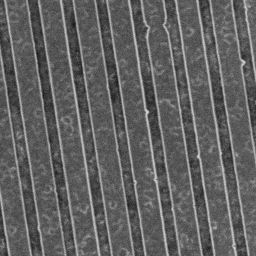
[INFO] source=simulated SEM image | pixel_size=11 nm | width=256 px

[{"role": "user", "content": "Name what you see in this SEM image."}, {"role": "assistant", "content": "parallel lines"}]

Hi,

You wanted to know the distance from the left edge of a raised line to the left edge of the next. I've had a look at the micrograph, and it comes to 371 nm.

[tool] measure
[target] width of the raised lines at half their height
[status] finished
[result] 243 nm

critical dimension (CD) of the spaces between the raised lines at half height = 0.132 µm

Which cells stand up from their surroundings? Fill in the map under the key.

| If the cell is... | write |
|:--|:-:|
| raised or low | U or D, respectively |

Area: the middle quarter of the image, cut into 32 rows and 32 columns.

UUDDDUUUUUDDDUUUUUUDDDUUUUUDDDDU
UUDDDUUUUUDDDUUUUUUDDDUUUUUDDDDU
UUDDDUUUUUUDDDUUUUUDDDUUUUUUDDDU
UUDDDUUUUUUDDDUUUUUDDDUUUUUUDDDU
UUDDDUUUUUUDDDUUUUUDDDUUUUUUDDDU
UUDDDDUUUUUDDDUUUUUDDDDUUUUUDDDU
UUUDDDUUUUUDDDUUUUUUDDDUUUUUDDDU
UUUDDDUUUUUDDDUUUUUUDDDUUUUUDDDD
UUUDDDUUUUUDDDUUUUUUDDDUUUUUUDDD
UUUDDDUUUUUUDDDUUUUUDDDUUUUUUDDD
UUUDDDUUUUUUDDDUUUUUDDDUUUUUUDDD
UUUDDDUUUUUUDDDUUUUUUDDDUUUUUDDD
UUUDDDDUUUUUDDDUUUUUUDDDUUUUUDDD
UUUUDDDUUUUUDDDUUUUUUDDDUUUUUDDD
UUUUDDDUUUUUDDDUUUUUUDDDUUUUUDDD
UUUUDDDUUUUUUDDUUUUUUDDDUUUUUUDD
UUUUDDDUUUUUUDDDUUUUUDDDUUUUUUDD
UUUUDDDUUUUUUDDDUUUUUDDDUUUUUUDD
UUUUDDDDUUUUUDDDUUUUUDDDDUUUUUDD
UUUUUDDDUUUUUDDDUUUUUUDDDUUUUUDD
UUUUUDDDUUUUUDDDUUUUUUDDDUUUUUDD
UUUUUDDDUUUUUDDDUUUUUUDDDUUUUUUD
UUUUUDDDUUUUUUDDDUUUUUDDDUUUUUUD
UUUUUDDDUUUUUUDDDUUUUUDDDUUUUUUD
UUUUUDDDUUUUUUDDDUUUUUDDDUUUUUUD
UUUUUDDDDUUUUUDDDUUUUUDDDDUUUUUD
UUUUUUDDDUUUUUDDDUUUUUUDDDUUUUUD
UUUUUUDDDUUUUUDDDUUUUUUDDDUUUUUD
UUUUUUDDDUUUUUUDDUUUUUUDDDUUUUUU
DUUUUUDDDUUUUUUDDDUUUUUDDDUUUUUU
DUUUUUDDDUUUUUUDDDUUUUUDDDUUUUUU
DUUUUUDDDUUUUUUDDDUUUUUDDDDUUUUU